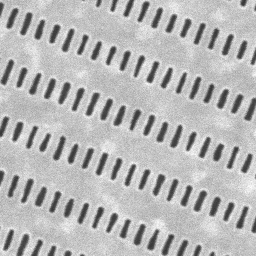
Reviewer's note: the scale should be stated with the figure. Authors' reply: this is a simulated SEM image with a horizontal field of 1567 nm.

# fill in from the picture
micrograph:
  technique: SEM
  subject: a regular array of holes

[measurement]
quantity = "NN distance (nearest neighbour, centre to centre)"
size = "0.0913 micrometres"